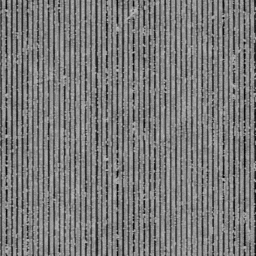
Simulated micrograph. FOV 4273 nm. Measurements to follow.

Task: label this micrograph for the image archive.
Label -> parallel lines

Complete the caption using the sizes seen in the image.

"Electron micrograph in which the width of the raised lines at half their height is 54.2 nanometers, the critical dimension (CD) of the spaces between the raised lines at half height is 0.0271 um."